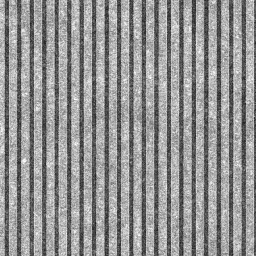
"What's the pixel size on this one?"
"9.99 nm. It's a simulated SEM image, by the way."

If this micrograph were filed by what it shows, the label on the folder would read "parallel lines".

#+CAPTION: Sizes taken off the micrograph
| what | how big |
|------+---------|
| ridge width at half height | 73.7 nm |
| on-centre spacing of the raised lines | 125 nm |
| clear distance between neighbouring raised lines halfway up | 48.7 nanometres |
